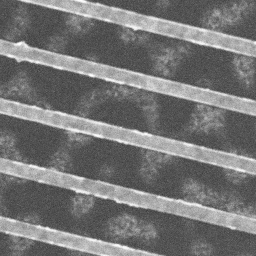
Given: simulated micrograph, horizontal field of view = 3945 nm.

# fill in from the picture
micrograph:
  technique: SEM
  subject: parallel lines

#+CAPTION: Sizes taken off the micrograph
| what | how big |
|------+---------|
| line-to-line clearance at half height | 674 nm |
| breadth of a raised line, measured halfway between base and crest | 0.206 micrometres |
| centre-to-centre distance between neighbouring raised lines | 884 nanometres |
